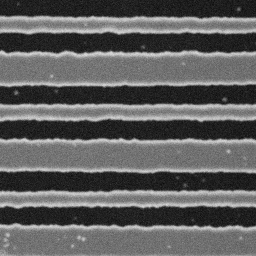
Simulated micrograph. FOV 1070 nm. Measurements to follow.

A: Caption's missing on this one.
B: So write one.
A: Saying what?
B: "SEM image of lines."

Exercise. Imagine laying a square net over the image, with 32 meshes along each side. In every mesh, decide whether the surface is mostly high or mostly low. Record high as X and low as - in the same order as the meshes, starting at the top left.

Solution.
--------------------------------
--------------------------------
XXXXXXXXXXXXXXXXXXXXXXXXXXXXXXXX
XXXXXXXXXXXXXXXXXXXXXXXXXXXXXXXX
--------------------------------
--------------------------------
X---X---X---X----------XX-------
XXXXXXXXXXXXXXXXXXXXXXXXXXXXXXXX
XXXXXXXXXXXXXXXXXXXXXXXXXXXXXXXX
XXXXXXXXXXXXXXXXXXXXXXXXXXXXXXXX
XXXXXXXXXXXXXXXXXXXXXXXXXXXXXXX-
--------------------------------
--------------------------------
XXXXXXXXXXXXXXXXXXXXXXXXXXXXXXXX
XXXXXXXXXXXXXXXXXXXXXXXXXXXXXXXX
--------------------------------
--------------------------------
XXXXXXXXXX-XXXXXX----XXXX--XXXXX
XXXXXXXXXXXXXXXXXXXXXXXXXXXXXXXX
XXXXXXXXXXXXXXXXXXXXXXXXXXXXXXXX
XXXXXXXXXXXXXXXXXXXXXXXXXXXXXXXX
-----------X-----XX----XX------X
--------------------------------
--------------------------------
XXXXXXXXXXXXXXXXXXXXXXXXXXXXXXXX
XXXXXXXXXXXXXXXXXXXXXXXXXXXXXXXX
--------------------------------
--------------------------------
XXXXXXXXXXXXXXXXXXXXXXXXXXXXXXXX
XXXXXXXXXXXXXXXXXXXXXXXXXXXXXXXX
XXXXXXXXXXXXXXXXXXXXXXXXXXXXXXXX
XXXXXXXXXXXXXXXXXXXXXXXXXXXXXXXX